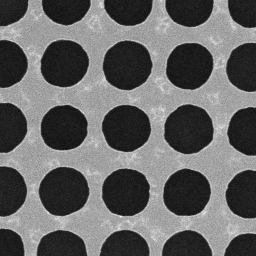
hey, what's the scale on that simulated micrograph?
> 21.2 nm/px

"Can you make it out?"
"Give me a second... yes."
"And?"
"a regular array of holes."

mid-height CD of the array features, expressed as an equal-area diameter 1030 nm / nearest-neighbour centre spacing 1320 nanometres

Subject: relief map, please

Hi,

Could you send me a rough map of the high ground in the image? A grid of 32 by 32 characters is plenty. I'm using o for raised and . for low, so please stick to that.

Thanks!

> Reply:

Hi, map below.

....o......oo......oo......o....
...oo......oo......oo......oo...
..oooo....oooo....oooo....ooo...
ooooooooooooooooooooooooooooooo.
oooooooooooooooooooooooooooooooo
..oooo....oooo....ooooo..ooooo..
...ooo.....oo......oo.....ooo...
...oo......oo......oo......o....
...oo......oo......oo......o....
...oo......oo......oo.....oo....
..oooo....oooo....oooo....ooo...
ooooooooooooooooooooooooooooooo.
oooooooooooooooooooooooooooooooo
..ooooo..ooooo...ooooo...oooooo.
...ooo.....oo.....ooo.....ooo...
...oo......oo......oo......oo...
...oo......oo......o.......o....
...oo......oo.....ooo......oo...
..oooo...ooooo...ooooo....ooo...
oooooooooooooooooooooooooooooooo
oooooooooooooooooooooooooooooooo
..oooo....oooo...ooooo...ooooo..
...oo......oo.....ooo.....ooo...
...oo......oo......o......oo....
...oo......oo......o......oo....
...oo......oo.....ooo.....oo....
..oooo...ooooo....ooo....oooo...
oooooooooooooooooooooooooooooooo
oooooooooooooooooooooooooooooooo
..oooo....oooo....oooo...ooooo..
...oo......oo.....ooo.....ooo...
...oo......oo......o......oo....